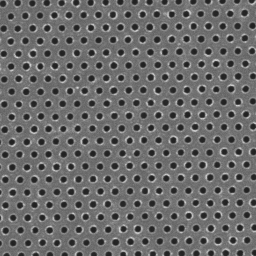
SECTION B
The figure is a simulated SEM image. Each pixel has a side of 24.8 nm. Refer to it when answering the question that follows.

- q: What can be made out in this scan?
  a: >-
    a regular array of holes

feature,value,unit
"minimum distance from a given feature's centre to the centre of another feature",0.354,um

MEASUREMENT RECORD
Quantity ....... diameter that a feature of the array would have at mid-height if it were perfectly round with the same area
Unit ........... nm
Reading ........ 168